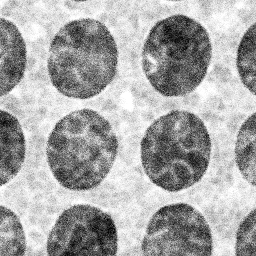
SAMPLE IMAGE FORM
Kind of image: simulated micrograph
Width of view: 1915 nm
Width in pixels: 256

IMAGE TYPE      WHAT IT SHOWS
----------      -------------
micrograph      holes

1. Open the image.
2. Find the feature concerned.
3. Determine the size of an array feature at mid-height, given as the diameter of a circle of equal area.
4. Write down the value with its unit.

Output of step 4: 576 nm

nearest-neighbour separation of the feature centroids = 0.693 micrometres